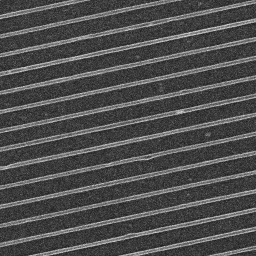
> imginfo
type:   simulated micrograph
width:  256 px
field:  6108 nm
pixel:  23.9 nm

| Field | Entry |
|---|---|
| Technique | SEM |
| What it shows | parallel lines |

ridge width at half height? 84.6 nanometres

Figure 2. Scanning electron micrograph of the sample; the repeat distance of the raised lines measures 443 nanometres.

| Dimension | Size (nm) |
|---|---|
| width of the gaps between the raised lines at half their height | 362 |